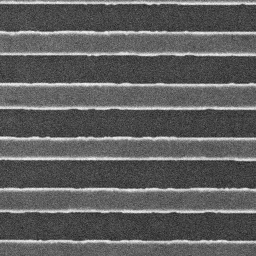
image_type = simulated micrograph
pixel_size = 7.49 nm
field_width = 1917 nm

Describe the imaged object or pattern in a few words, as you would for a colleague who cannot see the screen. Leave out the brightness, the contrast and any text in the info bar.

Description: lines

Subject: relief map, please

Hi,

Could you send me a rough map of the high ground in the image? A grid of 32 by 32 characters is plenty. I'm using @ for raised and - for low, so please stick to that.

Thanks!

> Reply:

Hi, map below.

------------------------@@@@@@-@
--------------------------------
--------------------------------
--------------------------------
@@@@@@@@@@@@@@@@@@@@@@@@@@@@@@@@
@@@@@@@@@@@@@@@@@@@@@@@@@@@@@@@@
@@@@@@@@@@@@@@@@@@@@@@@@@@@@@@@@
--------------------------------
--------------------------------
--------------------------------
@@@@@--@-@@@@@-@@---------------
@@@@@@@@@@@@@@@@@@@@@@@@@@@@@@@@
@@@@@@@@@@@@@@@@@@@@@@@@@@@@@@@@
@@@@@@@@@@@@@@@@@@@@@@@@@@@@@@@@
--------------------------------
--------------------------------
--------------------------------
@@@@@@@@@@@@@@@@@@@@@@@@@@@@@@@@
@@@@@@@@@@@@@@@@@@@@@@@@@@@@@@@@
@@@@@@@@@@@@@@@@@@@@@@@@@@@@@@@@
--------------------------------
--------------------------------
--------------------------------
--------------------------------
@@@@@@@@@@@@@@@@@@@@@@@@@@@@@@@@
@@@@@@@@@@@@@@@@@@@@@@@@@@@@@@@@
-----------------@--@--@@---@@-@
--------------------------------
--------------------------------
--------------------------------
@@@@@@@@@@@@@@@@@@@@@@@@@@@@@@@@
@@@@@@@@@@@@@@@@@@@@@@@@@@@@@@@@